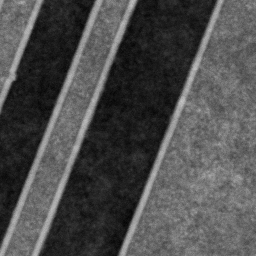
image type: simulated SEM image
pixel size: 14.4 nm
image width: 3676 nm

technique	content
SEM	one or a few lines or trenches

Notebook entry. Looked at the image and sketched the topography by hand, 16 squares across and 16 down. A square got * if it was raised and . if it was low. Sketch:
**....**......**
**....**.....***
*....**......***
*....**.....****
*....**.....****
....**......****
....**.....*****
...**......*****
...**......*****
...**.....******
..**......******
..**.....*******
.**......*******
.**......*******
.**.....********
**......********